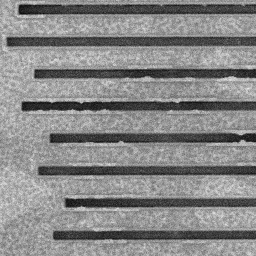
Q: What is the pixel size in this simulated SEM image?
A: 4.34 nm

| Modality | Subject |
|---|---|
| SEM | parallel lines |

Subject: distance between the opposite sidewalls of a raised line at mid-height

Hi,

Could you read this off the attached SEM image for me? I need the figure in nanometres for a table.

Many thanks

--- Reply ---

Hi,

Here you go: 97.6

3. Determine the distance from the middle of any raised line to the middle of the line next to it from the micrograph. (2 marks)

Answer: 140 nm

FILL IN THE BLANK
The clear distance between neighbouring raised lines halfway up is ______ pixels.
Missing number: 9.86